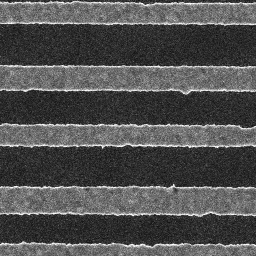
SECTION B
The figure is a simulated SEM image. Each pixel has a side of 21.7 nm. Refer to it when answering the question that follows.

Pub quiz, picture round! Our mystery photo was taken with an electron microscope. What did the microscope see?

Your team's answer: one or a few lines or trenches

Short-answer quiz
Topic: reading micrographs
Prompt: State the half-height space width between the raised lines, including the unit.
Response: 832 nanometres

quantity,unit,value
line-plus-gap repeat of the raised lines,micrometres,1.35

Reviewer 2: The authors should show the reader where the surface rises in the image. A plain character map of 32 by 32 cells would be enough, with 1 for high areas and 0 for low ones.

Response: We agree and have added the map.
11111111111111111101111111111111
11111111111111111111111111111111
11111111111111111111111111111111
00000000000000000000000000000000
00000000000000000000000000000000
00000000000000000000000000000000
00000000000000000000000000000000
00000000000000000000000000000000
11111111111111111111111111111111
11111111111111111111111111111111
11111111111111111111111111111111
00000000000000000000000100000000
00000000000000000000000000000000
00000000000000000000000000000000
00000000000000000000000000000000
10000000000000000000000000000000
11111111111111111111111111111111
11111111111111111111111111111111
00000000000000000000000000000000
00000000000000000000000000000000
00000000000000000000000000000000
00000000000000000000000000000000
00000000000000000000000000000000
11111111111111111111111111111111
11111111111111111111111111111111
11111111111111111111111111111111
11111111111111111111111111111111
00000000000000000000000000000000
00000000000000000000000000000000
00000000000000000000000000000000
11111111000010100000000100000000
11111111111111111111111111111111